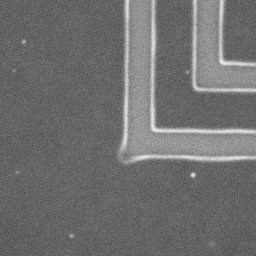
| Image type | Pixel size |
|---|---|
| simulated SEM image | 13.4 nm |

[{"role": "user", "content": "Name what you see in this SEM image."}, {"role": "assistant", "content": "groups of lines, slits or small figures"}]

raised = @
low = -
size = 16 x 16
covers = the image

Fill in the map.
@@@@@@@@--@@--@@
@@@@@@@@--@@--@@
@@@@@@@@--@@--@@
@@@@@@@@--@@--@@
@@@@@@@@--@@----
@@@@@@@@--@@@---
@@@@@@@@--@@@@@@
@@@@@@@@--@@@@@@
@@@@@@@@--------
@@@@@@@@--------
@@@@@@@@@@@@@@@@
@@@@@@@@@@@@@@@@
@@@@@@@@@@@@@@@@
@@@@@@@@@@@@@@@@
@@@@@@@@@@@@@@@@
@@@@@@@@@@@@@@@@